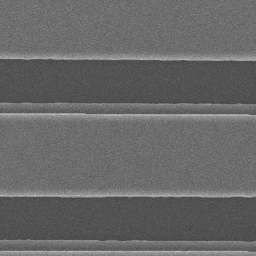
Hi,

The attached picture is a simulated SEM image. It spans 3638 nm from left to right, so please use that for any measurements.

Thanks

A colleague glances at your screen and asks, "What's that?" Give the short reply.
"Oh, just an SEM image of lines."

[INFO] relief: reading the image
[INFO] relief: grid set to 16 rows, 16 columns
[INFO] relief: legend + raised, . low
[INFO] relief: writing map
++++++++++++++++
++++++++++++++++
++++++++++++++++
++++++++++++++++
................
................
++++++++++++++..
++++++++++++++++
++++++++++++++++
++++++++++++++++
++++++++++++++++
++++++++++++++++
................
................
................
++++++++++++++++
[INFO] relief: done